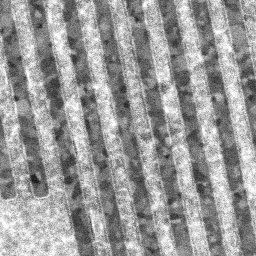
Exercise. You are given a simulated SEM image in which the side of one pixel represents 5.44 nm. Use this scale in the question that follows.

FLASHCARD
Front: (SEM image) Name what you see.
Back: parallel lines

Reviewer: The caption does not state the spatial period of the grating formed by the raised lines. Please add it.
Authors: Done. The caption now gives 175 nm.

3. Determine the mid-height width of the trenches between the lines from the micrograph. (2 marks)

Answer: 83.3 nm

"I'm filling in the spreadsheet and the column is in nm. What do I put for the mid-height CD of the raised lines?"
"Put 93.3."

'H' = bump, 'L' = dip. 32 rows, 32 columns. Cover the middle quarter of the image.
LLHHHHLLLLHHHHHLHHHHHHHLLLLHHHHL
LLLHHHHLLLLHHHHLHHLHHHHLLHLHHHHL
LLLHHHHLLLLHHHHLLLLHHHHLLHHHHHHH
LLLHHHHLLLLHHHHLLLLHHHHLLLLHHHHH
LLLHHHHLLLLHHHHHLLLHHHHLLLLHHHHH
HLLHHHHLLLLHHHHHLLLHHHHHLLLLHHHH
HLLHHHHHLLLHHHHHLLLLHHHHLLLLHHHH
LLLHHHHHLLLLHHHHLLLLHHHHLLLLHHHH
LLLLHHHHLLLLHHHHLLLLHHHHHLLLHHHH
LLLLHHHHLLLLHHHHLLLLHHHHHLLLLHHH
LLLLHHHHLLLLHHHHHLLLHHHHHLLLLHHH
HLLLHHHHHLLLLHHHHLLLLHHHHLLLLHHH
HLLLLHHHHLLLLHHHHLLLLHHHHLLLLHHH
HLLLLHHHHLLLLHHHHLLLLHHHHLLLLHHH
HLLLLHHHHLLLLHHHHHLLLHHHHHLLLLHH
HLLLLHHHHLLLLHHHHHLLLHHHHHLLLLHH
HHLLLHHHHHLLLHHHHHLLLLHHHHLLLLHH
HHLLLLHHHHLLLLHHHHLLLLHHHHLLLLHH
HHLLLLHHHHLLLLHHHHLLLLHHHHHLLLHH
HHLHLLHHHHLLLLHHHHHLLLHHHHHLLLLH
HHLHLLHHHHLLLLHHHHHLLLLHHHHLLLLH
HHHHLLHHHHHLLLHHHHHLLLLHHHHLLLLH
HHHLLLLHHHHLLLLHHHHLLLLHHHHLLLLH
HHHLLLLHHHHLLLLHHHHLLLLHHHHLLLLH
HHHLLLLHHHHLLHLHHHHHLLLLHHHHLLLL
HHHLLHLHHHHLLLLHHHHHLLLLHHHHLLHL
HHHHLHLHHHHHLLLHHHHHLLLLHHHHLLHL
HHHHLLLLHHHHLLLLHHHHLLLLHHHHLLLL
HHHHLLLLHHHHLLLLHHHHLLLLHHHHHLLL
HHHHLLLLHHHHLLLLHHHHHLLLHHHHHLLL
HHHHLLLLHHHHLLLLHHHHHLLLLHHHHLLL
HHHHHLLLHHHHHLLLHHHHHLLLLHHHHLLL